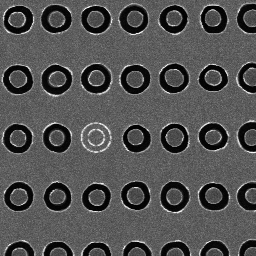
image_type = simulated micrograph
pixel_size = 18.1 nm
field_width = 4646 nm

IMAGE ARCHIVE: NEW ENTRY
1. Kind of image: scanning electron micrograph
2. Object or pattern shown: a regular array of ring-shaped grooves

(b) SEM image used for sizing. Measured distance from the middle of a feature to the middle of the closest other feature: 699 nanometers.